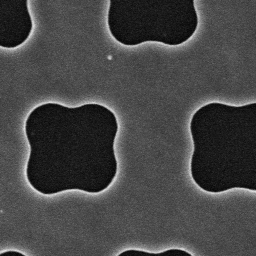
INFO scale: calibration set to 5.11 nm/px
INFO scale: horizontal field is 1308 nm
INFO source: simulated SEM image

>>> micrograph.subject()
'holes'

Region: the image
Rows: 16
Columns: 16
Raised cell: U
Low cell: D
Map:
DDUUUUUDDDDDUUUU
DDUUUUUDDDDDUUUU
DDUUUUUDDDDDUUUU
UUUUUUUUUUUUUUUU
UUUUUUUUUUUUUUUU
UUUUUUUUUUUUUUUU
UUUDUUUUUUUUUDUU
UUDDDDDUUUUUDDDD
UUDDDDDUUUUUDDDD
UUDDDDDUUUUUDDDD
UUDDDDDUUUUUDDDD
UUDDDDDUUUUUDDDD
UUUUUUUUUUUUUUUU
UUUUUUUUUUUUUUUU
UUUUUUUUUUUUUUUU
UUUUUUUUUUUUUUUU